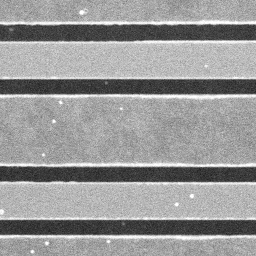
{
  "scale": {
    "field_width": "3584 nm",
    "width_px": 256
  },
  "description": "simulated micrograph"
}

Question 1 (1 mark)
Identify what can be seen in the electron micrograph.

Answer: lines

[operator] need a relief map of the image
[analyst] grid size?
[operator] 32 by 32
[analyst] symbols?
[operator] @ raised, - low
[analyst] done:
@@@@@@@@@@@@@@@@@@@@@@@@@@@@@@@@
@@@@@@@@@@@@@@@@@@@@@@@@@@@@@@@@
@@@@@@@@@@@@@@@@@@@@@@@@@@@@@@@@
--------------------------------
--------------------------------
@@@@@@@@@@@@@@@@@@@@@@@@@@@@@@@@
@@@@@@@@@@@@@@@@@@@@@@@@@@@@@@@@
@@@@@@@@@@@@@@@@@@@@@@@@@@@@@@@@
@@@@@@@@@@@@@@@@@@@@@@@@@@@@@@@@
@@@@@@@@@@@@@@@@@@@@@@@@@@@@@@@@
--------------------------------
--------------------------------
@@@@@@@@@@@@@@@@@@@@@@@@@@@@@@@@
@@@@@@@@@@@@@@@@@@@@@@@@@@@@@@@@
@@@@@@@@@@@@@@@@@@@@@@@@@@@@@@@@
@@@@@@@@@@@@@@@@@@@@@@@@@@@@@@@@
@@@@@@@@@@@@@@@@@@@@@@@@@@@@@@@@
@@@@@@@@@@@@@@@@@@@@@@@@@@@@@@@@
@@@@@@@@@@@@@@@@@@@@@@@@@@@@@@@@
@@@@@@@@@@@@@@@@@@@@@@@@@@@@@@@@
@@@@@@@@@@@@@@@@@@@@@@@@@@@@@@@@
--------------------------------
--------------------------------
@@@@@@@@@@@@@@@@@@@@@@@@@@@@@@@@
@@@@@@@@@@@@@@@@@@@@@@@@@@@@@@@@
@@@@@@@@@@@@@@@@@@@@@@@@@@@@@@@@
@@@@@@@@@@@@@@@@@@@@@@@@@@@@@@@@
--------------------------------
--------------------------------
@@@@@@@@@@@@@@@@@@@-@@-----@--@-
@@@@@@@@@@@@@@@@@@@@@@@@@@@@@@@@
@@@@@@@@@@@@@@@@@@@@@@@@@@@@@@@@